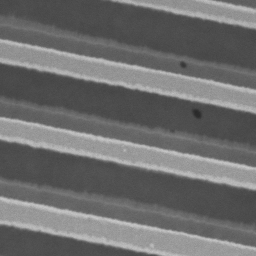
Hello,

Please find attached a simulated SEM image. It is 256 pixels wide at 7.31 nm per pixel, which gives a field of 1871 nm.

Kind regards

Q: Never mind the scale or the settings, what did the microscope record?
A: lines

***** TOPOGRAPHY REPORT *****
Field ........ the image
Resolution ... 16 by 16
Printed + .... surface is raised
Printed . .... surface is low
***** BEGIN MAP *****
.........+++++++
...............+
+++++...........
++++++++++......
...++++++++++++.
........++++++++
+............+++
++++++..........
+++++++++++.....
....++++++++++++
.........+++++++
+.............++
++++++..........
+++++++++++.....
...+++++++++++++
........++++++++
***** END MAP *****